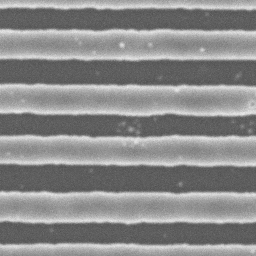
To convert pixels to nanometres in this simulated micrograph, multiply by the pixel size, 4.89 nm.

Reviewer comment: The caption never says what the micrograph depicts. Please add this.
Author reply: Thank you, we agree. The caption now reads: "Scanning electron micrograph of lines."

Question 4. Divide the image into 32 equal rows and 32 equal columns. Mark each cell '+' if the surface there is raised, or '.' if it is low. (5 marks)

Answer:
++++++++++++++++++++++++++++++++
................................
................................
................................
++++++++++++++++++++++++++++++++
++++++++++++++++++++++++++++++++
++++++++++++++++++++++++++++++++
................................
................................
................................
................................
++++++++++++++++++++++++++++++++
++++++++++++++++++++++++++++++++
++++++++++++++++++++++++++++++++
................................
................................
................................
++++++++++++++++++++++++++++++++
++++++++++++++++++++++++++++++++
++++++++++++++++++++++++++++++++
............++++++++++++++++++++
................................
................................
................................
++++++++++++++++++++++++++++++++
++++++++++++++++++++++++++++++++
++++++++++++++++++++++++++++++++
++++++++++++++++++++++++++++++++
................................
................................
................................
++++++++++++++++++++++++++++++++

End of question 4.